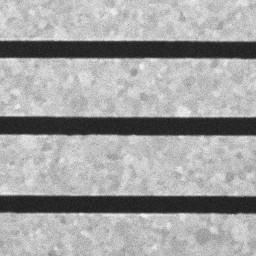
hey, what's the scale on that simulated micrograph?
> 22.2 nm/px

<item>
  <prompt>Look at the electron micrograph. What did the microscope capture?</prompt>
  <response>lines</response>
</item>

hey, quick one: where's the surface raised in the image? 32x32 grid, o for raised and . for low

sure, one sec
oooooooooooooooooooooooooooooooo
oooooooooooooooooooooooooooooooo
oooooooooooooooooooooooooooooooo
oooooooooooooooooooooooooooooooo
oooooooooooooooooooooooooooooooo
................................
................................
oooooooooooooooooooooooooooooooo
oooooooooooooooooooooooooooooooo
oooooooooooooooooooooooooooooooo
oooooooooooooooooooooooooooooooo
oooooooooooooooooooooooooooooooo
oooooooooooooooooooooooooooooooo
oooooooooooooooooooooooooooooooo
..........oooooooooooooooooooooo
................................
................................
oooooooooooooooooooooooooooooooo
oooooooooooooooooooooooooooooooo
oooooooooooooooooooooooooooooooo
oooooooooooooooooooooooooooooooo
oooooooooooooooooooooooooooooooo
oooooooooooooooooooooooooooooooo
oooooooooooooooooooooooooooooooo
.............................ooo
................................
................................
oooooooooooooooooooooooooooooooo
oooooooooooooooooooooooooooooooo
oooooooooooooooooooooooooooooooo
oooooooooooooooooooooooooooooooo
oooooooooooooooooooooooooooooooo